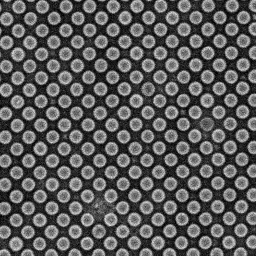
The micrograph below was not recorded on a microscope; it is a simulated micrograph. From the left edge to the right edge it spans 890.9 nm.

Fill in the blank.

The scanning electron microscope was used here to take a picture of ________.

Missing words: a regular array of raised bodies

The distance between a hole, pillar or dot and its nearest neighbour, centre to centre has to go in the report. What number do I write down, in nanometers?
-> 57.3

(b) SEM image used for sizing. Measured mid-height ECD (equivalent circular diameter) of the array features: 0.0435 µm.